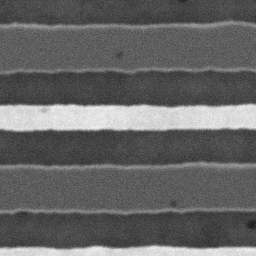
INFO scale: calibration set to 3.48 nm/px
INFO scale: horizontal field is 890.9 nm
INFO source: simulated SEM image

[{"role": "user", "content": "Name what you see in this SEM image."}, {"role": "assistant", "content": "lines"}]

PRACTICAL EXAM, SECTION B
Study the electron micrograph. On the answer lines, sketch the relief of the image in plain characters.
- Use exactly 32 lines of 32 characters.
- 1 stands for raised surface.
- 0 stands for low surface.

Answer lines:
00000000000000000000000000000000
00000000000000000000000000000000
00000000000000000000000000000000
11111111111111111111111111111111
11111111111111111111111111111111
11111111111111111111111111111111
11111111111111111111111111111111
11111111111111111111111111111111
11111111111111111111111111111111
00000000000000000000000000000000
00000000000000000000000000000000
00000000000000000000000000000000
00000000000000000000000000000000
11111111111111111111101111111111
11111111111111111111111111111111
11111111111111111111111111111111
00000000000000000000000000000000
00000000000000000000000000000000
00000000000000000000000000000000
00000000000000000000000000000000
00000000000000000000000111100000
11111111111111111111111111111111
11111111111111111111111111111111
11111111111111111111111111111111
11111111111111111111111111111111
11111111111111111111111111111111
11000011001111111111000000000000
00000000000000000000000000000000
00000000000000000000000000000000
00000000000000000000000000000000
00000000000000000000000000000000
11111111111111111111111111111111